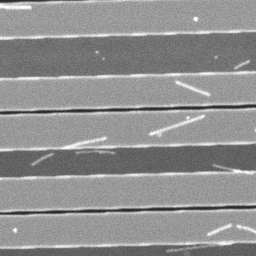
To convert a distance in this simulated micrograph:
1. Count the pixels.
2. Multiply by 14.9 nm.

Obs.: lines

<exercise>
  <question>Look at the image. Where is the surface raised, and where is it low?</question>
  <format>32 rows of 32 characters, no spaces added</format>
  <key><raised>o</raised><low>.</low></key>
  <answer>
oooooooooooooooooooooooooooooooo
oooooooooooooooooooooooooooooooo
oooooooooooooooooooooooooooooooo
oooooooooooooooooooooooooooooooo
oooooooooo......................
................................
................................
................................
................................
................oooooooooooooooo
oooooooooooooooooooooooooooooooo
oooooooooooooooooooooooooooooooo
oooooooooooooooooooooooooooooooo
ooooooooooooooooooooooo.oooo.ooo
oooooooooooooooooooooooooooooooo
oooooooooooooooooooooooooooooooo
oooooooooooooooooooooooooooooooo
oooooooooooooooooooooooooooooooo
oooooooooo......................
................................
................................
.............................ooo
oooooooooooooooooooooooooooooooo
oooooooooooooooooooooooooooooooo
oooooooooooooooooooooooooooooooo
oooooooooooooooooooooooooooooooo
ooooooooooo.oooooooooooooooooooo
oooooooooooooooooooooooooooooooo
oooooooooooooooooooooooooooooooo
oooooooooooooooooooooooooooooooo
ooooooooooooooooooooooooo..oo...
................................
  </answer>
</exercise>